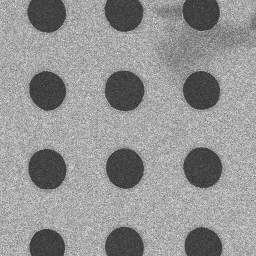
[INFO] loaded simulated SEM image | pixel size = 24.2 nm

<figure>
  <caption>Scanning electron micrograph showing holes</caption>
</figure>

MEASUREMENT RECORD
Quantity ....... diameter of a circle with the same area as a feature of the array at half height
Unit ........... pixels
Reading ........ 39.4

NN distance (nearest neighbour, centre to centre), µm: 1.86